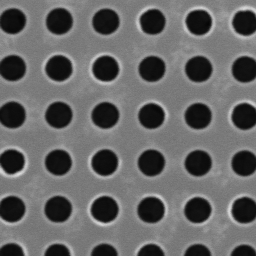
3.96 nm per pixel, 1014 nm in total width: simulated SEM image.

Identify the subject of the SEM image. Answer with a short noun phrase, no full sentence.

a regular array of holes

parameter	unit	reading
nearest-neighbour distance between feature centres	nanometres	184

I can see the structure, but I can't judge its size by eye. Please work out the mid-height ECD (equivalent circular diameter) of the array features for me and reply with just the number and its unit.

0.106 microns